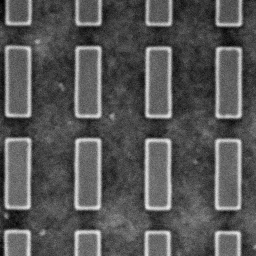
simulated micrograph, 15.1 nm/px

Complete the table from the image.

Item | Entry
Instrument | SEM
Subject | groups of lines, slits or small figures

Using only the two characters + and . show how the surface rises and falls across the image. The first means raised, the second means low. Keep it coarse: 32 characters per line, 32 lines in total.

.+++......+++.....+++......+++..
.+++......+++.....+++......+++..
.+++......+++.....+++......+++..
................................
................................
................................
.+++......++......+++......+++..
.+++......++......+++......+++..
.+++......++......+++......+++..
.+++......++......+++......+++..
.+++......++......+++......+++..
.+++......++......+++......+++..
.+++......++......+++......+++..
.+++......++......+++......+++..
..........++.......++......+++..
................................
................................
.++.......++....................
.+++......++......+++......+++..
.+++......++......+++......+++..
.+++......++......+++......+++..
.+++......++......+++......+++..
.+++......++......+++......+++..
.+++......++......+++......+++..
.+++......++......+++......+++..
.+++......++......+++......+++..
................................
................................
................................
.+++......++......+++......+++..
.+++......++......+++......+++..
.+++......++......+++......+++..